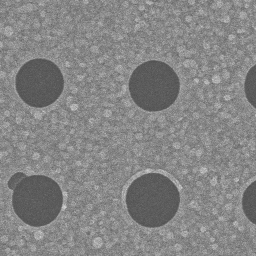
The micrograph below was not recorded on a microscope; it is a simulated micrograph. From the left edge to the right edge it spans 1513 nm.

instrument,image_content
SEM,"holes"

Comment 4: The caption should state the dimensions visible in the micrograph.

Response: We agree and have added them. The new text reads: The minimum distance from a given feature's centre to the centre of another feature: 676 nanometers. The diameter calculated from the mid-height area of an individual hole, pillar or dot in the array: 0.311 micrometres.